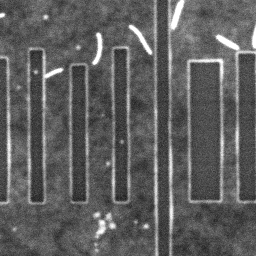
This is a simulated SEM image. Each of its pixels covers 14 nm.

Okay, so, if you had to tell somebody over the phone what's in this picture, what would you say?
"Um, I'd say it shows groups of lines, slits or small figures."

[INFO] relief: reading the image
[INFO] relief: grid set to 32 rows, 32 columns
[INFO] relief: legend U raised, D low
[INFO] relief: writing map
UUUUUUUUUUUUUUUUUUUDDUUUUUUUUUUU
UUUUUUUUUUUUUUUUUUUDDUUUUUUUUUUU
UUUUUUUUUUUUUUUUUUUDDUUUUUUUUUUU
UUUUUUUUUUUUUUUUUUUDDUUUUUUUUUUU
UUUUUUUUUUUUUUUUUUUDDUUUUUUUUUUU
UUUUUUUUUUUUUUUUUUUDDUUUUUUUUUUU
UUUUDUUUUUUUUUDDUUUDDUUUUUUUUUDD
DUUUDDUUUUUUUUDDUUUDDUUUUUUUUUDD
DUUUDDUUUDDUUUDDUUUDDUUUDDDDUUDD
DUUUDDUUUDDUUUDDUUUDDUUUDDDDUUDD
DUUUDDUUUDDUUUDDUUUDDUUUDDDDUUDD
DUUUDDUUUDDUUUDDUUUDDUUUDDDDUUDD
DUUUDDUUUDDUUUDDUUUDDUUUDDDDUUDD
DUUUDDUUUDDUUUDDUUUDDUUUDDDDUUDD
DUUUDDUUUDDUUUDDUUUDDUUUDDDDUUDD
DUUUDDUUUDDUUUDDUUUDDUUUDDDDUUDD
DUUUDDUUUDDUUUDDUUUDDUUUDDDDUUDD
DUUUDDUUUDDUUUDDUUUDDUUUDDDDUUDD
DUUUDDUUUDDUUUDDUUUDDUUUDDDDUUDD
DUUUDDUUUDDUUUDDUUUDDUUUDDDDUUDD
DUUUDDUUUDDUUUDDUUUDDUUUDDDDUUDD
DUUUDDUUUDDUUUDDUUUDDUUUDDDDUUDD
DUUUDDUUUDDUUUDDUUUDDUUUDDDDUUDD
DUUUDDUUUDDUUUDDUUUDDUUUDDDDUUDD
DUUUDDUUUDDUUUDDUUUDDUUUDDDDUUDD
UUUUUUUUUUUUUUUUUUUDDUUUUUUUUUUU
UUUUUUUUUUUUUUUUUUUDDUUUUUUUUUUU
UUUUUUUUUUUUUUUUUUUUDUUUUUUUUUUU
UUUUUUUUUUUUUUUUUUUUDUUUUUUUUUUU
UUUUUUUUUUUUUUUUUUUUDUUUUUUUUUUU
UUUUUUUUUUUUUUUUUUUUDUUUUUUUUUUU
UUUUUUUUUUUUUUUUUUUUDUUUUUUUUUUU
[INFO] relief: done